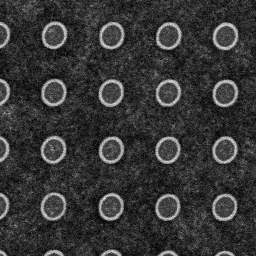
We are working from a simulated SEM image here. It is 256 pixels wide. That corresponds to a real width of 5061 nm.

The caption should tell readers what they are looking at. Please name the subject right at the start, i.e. a regular array of raised bodies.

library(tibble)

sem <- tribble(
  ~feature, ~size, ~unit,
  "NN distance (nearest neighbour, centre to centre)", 1120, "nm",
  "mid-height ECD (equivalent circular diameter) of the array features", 474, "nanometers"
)